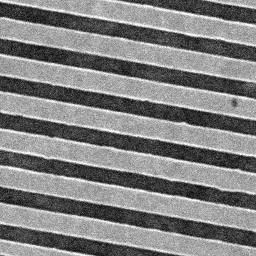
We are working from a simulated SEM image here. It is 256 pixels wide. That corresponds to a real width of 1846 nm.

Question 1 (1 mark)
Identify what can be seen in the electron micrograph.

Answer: parallel lines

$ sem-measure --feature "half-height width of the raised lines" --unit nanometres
143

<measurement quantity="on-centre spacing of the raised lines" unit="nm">263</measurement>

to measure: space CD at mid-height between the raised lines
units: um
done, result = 0.122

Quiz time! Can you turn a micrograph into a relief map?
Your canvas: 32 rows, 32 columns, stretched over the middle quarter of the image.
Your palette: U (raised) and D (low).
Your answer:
DDDDDDDDDDDDDDDDDDDDDDDDUUUUUUUU
UUUUUUDDDDDDDDDDDDDDDDDDDDDDDUUU
UUUUUUUUUUUDDDDDDDDDDDDDDDDDDDDD
UUUUUUUUUUUUUUUUUDDDDDDDDDDDDDDD
UUUUUUUUUUUUUUUUUUUUUUDDDDDDDDDD
UUUUUUUUUUUUUUUUUUUUUUUUUUUDDDDD
DDDDDUUUUUUUUUUUUUUUUUUUUUUUUUUU
DDDDDDDDDDDDUUUUUUUUUUUUUUUUUUUU
DDDDDDDDDDDDDDDDDUUUUUUUUUUUUUUU
DDDDDDDDDDDDDDDDDDDDDDDUUUUUUUUU
UUUUDDDDDDDDDDDDDDDDDDDDDDDDDUUU
UUUUUUUUUUDDDDDDDDDDDDDDDDDDDDDD
UUUUUUUUUUUUUUUDDDDDDDDDDDDDDDDD
UUUUUUUUUUUUUUUUUUUUUDDDDDDDDDDD
UUUUUUUUUUUUUUUUUUUUUUUUUUUDDDDD
DDDDUUUUUUUUUUUUUUUUUUUUUUUUUUUU
DDDDDDDDDDUUUUUUUUUUUUUUUUUUUUUU
DDDDDDDDDDDDDDDDUUUUUUUUUUUUUUUU
DDDDDDDDDDDDDDDDDDDDDUUUUUUUUUUU
UUDDDDDDDDDDDDDDDDDDDDDDDDDUUUUU
UUUUUUUUDDDDDDDDDDDDDDDDDDDDDDDD
UUUUUUUUUUUUUDDDDDDDDDDDDDDDDDDD
UUUUUUUUUUUUUUUUUUUDDDDDDDDDDDDD
UUUUUUUUUUUUUUUUUUUUUUUUUUDDDDDD
DDDUUUUUUUUUUUUUUUUUUUUUUUUUUUDD
DDDDDDDDUUUUUUUUUUUUUUUUUUUUUUUU
DDDDDDDDDDDDDDDUUUUUUUUUUUUUUUUU
DDDDDDDDDDDDDDDDDDDDDUUUUUUUUUUU
UDDDDDDDDDDDDDDDDDDDDDDDDUUUUUUU
UUUUUUDDDDDDDDDDDDDDDDDDDDDDDDDU
UUUUUUUUUUUUDDDDDDDDDDDDDDDDDDDD
UUUUUUUUUUUUUUUUUUDDDDDDDDDDDDDD